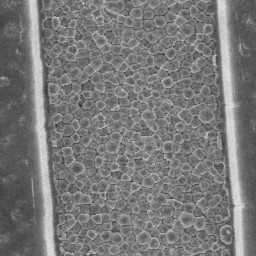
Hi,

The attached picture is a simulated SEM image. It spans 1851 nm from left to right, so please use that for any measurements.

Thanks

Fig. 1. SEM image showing one or a few lines or trenches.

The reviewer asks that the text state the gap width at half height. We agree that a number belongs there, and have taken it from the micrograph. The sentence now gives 1360 nm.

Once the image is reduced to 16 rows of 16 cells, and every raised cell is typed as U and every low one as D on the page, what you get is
UUDDDDDDDDDDDDUU
UUDDDDDDDDDDDDUU
UUDDDDDDDDDDDDUU
UUDDDDDDDDDDDDUU
UUDDDDDDDDDDDDUU
UUDDDDDDDDDDDDUU
UUDDDDDDDDDDDDUU
UUUDDDDDDDDDDDUU
UUUDDDDDDDDDDDUU
UUUDDDDDDDDDDDDU
UUUDDDDDDDDDDDDU
UUUDDDDDDDDDDDDU
UUUDDDDDDDDDDDDU
UUUDDDDDDDDDDDDU
UUUDDDDDDDDDDDDU
UUUDDDDDDDDDDDDU